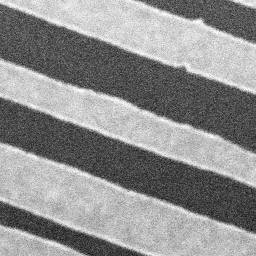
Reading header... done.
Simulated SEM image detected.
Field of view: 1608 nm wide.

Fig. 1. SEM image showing one or a few lines or trenches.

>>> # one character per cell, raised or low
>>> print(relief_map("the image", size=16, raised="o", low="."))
.oooooooo.......
....ooooooooo...
.......oooooooo.
.........ooooooo
oo..........oooo
ooooo..........o
..oooooo........
....oooooo......
.......oooooo...
o.........ooooo.
oooo.........ooo
ooooooo.........
oooooooooo......
...ooooooooo....
o....oooooooooo.
oooo....oooooooo